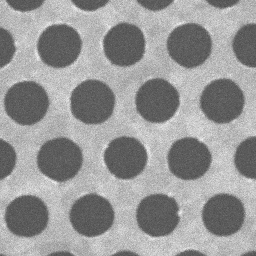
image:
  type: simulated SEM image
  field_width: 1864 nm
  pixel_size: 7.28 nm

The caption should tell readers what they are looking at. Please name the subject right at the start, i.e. a regular array of holes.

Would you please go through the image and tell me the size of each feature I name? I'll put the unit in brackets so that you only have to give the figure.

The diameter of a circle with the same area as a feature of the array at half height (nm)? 327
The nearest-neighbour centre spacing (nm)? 471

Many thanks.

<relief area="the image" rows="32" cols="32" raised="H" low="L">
HLLLLHHHHLLLLHHHHLLLLHHHHHLLLLHH
HHHHHHHHHHHHHHHHHHHHHHHHHHHHHHHH
HHHHHHHHHHHHHHHHHHHHHHHHHHHHHHHH
LHHHHHLLLHHHHHLLLHHHHHLLLLHHHHLL
LLHHHLLLLLHHHLLLLLHHHLLLLLHHHLLL
LLHHHLLLLLHHHLLLLLHHHLLLLLLHHLLL
LLHHHLLLLLHHHLLLLLHHHLLLLLHHHLLL
LHHHHLLLLLHHHLLLLLHHHHLLLLHHHHLL
HHHHHHHLHHHHHHHHHHHHHHHLHHHHHHHH
HHHHHHHHHHHHHHHHHHHHHHHHHHHHHHHH
HHLLLHHHHHLLLHHHHHLLLHHHHHLLLLHH
HLLLLLHHHLLLLLHHHLLLLLHHHLLLLLHH
LLLLLLHHHLLLLLHHHLLLLLLHHLLLLLLH
LLLLLLHHHLLLLLHHHLLLLLHHHLLLLLLH
HLLLLLHHHLLLLLHHHHLLLLHHHHLLLLHH
HHLLHHHHHHHLLHHHHHHHHHHHHHHLHHHH
HHHHHHHHHHHHHHHHHHHHHHHHHHHHHHHH
LHHHHHLLLHHHHHLLLHHHHHLLLHHHHHLL
LLHHHLLLLLHHHLLLLLHHHLLLLLHHHHLL
LLHHHLLLLLHHHLLLLLLHHLLLLLLHHLLL
LLHHHLLLLLHHHLLLLLHHHLLLLLHHHLLL
LLHHHLLLLLHHHHLLLLHHHLLLLLHHHHLL
HHHHHHHLHHHHHHHHHHHHHHHLHHHHHHHH
HHHHHHHHHHHHHHHHHHHHHHHHHHHHHHHH
HHLLHHHHHHLLLHHHHHLLLHHHHHHLLHHH
HLLLLLHHHLLLLLHHHLLLLLHHHHLLLLHH
HLLLLLHHHLLLLLHHHLLLLLHHHLLLLLLH
HLLLLLHHHLLLLLHHHLLLLLHHHLLLLLLH
HLLLLLHHHLLLLLHHHLLLLLHHHHLLLLHH
HHLLHHHHHHLLHHHHHHHLLHHHHHHLLHHH
HHHHHHHHHHHHHHHHHHHHHHHHHHHHHHHH
HHHHHHHLLHHHHHHLLHHHHHHLLHHHHHHL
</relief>